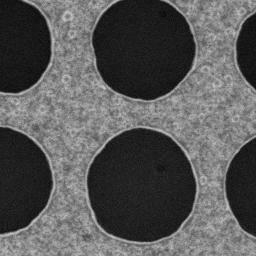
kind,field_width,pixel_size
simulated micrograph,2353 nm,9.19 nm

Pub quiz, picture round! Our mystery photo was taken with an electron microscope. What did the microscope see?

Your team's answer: holes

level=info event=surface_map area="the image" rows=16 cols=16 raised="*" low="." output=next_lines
..*****....*****
...***......***.
...***......***.
...***......***.
...***......***.
..*****....*****
****************
****************
..*****....*****
...***......***.
...***......**..
...**.......**..
...***......**..
..****......***.
.******....****.
****************